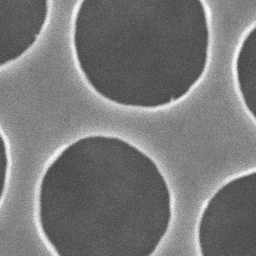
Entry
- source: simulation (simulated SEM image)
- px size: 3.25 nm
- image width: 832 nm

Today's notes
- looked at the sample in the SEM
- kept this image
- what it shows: holes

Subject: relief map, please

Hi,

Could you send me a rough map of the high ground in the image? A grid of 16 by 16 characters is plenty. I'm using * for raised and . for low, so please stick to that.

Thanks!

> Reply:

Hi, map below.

...**........***
...**........***
..***........**.
.****........**.
*****........**.
******......***.
********..*****.
****************
****************
****.....*******
***.......******
***.......****..
**.........**...
**.........**...
***.......**....
***.......***...